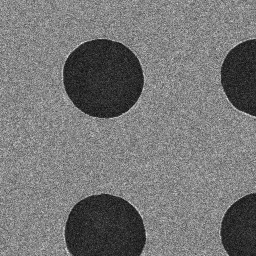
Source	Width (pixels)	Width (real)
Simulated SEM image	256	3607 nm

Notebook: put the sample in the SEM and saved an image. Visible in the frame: holes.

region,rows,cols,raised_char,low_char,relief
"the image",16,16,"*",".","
****************
****************
******.*********
****....******..
****.....*****..
****.....*****..
*****...*******.
****************
****************
****************
****************
****************
*****...*******.
****.....*****..
****.....*****..
****.....*****..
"